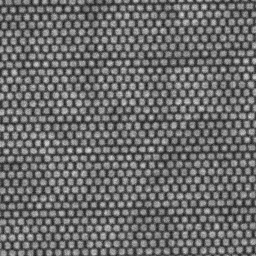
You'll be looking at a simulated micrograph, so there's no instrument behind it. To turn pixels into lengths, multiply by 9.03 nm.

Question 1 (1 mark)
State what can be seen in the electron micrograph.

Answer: a regular array of raised bodies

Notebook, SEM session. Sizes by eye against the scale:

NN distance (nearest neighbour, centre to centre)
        79.1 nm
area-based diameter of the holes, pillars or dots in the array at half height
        0.053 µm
